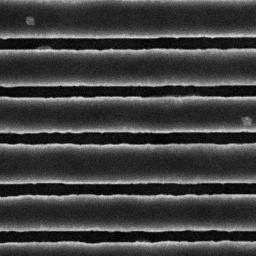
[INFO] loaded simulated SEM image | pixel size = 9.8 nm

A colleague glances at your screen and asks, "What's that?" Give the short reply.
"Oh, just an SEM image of lines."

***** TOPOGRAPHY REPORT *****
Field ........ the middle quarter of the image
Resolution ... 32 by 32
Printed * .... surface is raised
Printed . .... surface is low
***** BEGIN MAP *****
********************************
********************************
********************************
********************************
********************************
................................
................................
................................
...**...***....***.............*
********************************
********************************
********************************
********************************
********************************
********************************
********************************
********************************
................................
................................
................................
*********.**********************
********************************
********************************
********************************
********************************
********************************
********************************
********************************
********************************
********************************
................................
................................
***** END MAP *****